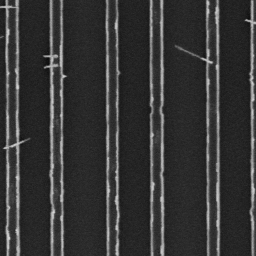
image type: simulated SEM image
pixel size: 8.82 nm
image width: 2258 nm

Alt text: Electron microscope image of parallel lines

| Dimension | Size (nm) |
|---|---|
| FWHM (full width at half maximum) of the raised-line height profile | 99.2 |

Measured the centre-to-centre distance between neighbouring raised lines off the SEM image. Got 442 nm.